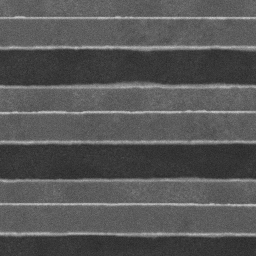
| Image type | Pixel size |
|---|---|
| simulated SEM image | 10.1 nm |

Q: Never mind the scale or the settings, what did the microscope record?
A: lines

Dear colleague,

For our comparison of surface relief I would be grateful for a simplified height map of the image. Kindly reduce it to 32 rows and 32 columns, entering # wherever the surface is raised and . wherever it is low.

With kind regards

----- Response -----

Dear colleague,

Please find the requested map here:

################################
################################
################################
################################
################################
################################
................................
................................
................................
................................
................................
################################
################################
################################
################################
################################
################################
################################
................................
................................
................................
................................
....................#.......##..
################################
################################
################################
################################
################################
################################
................................
................................
................................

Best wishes